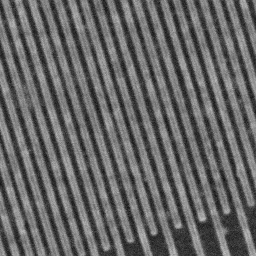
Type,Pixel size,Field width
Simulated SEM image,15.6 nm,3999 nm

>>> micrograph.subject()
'parallel lines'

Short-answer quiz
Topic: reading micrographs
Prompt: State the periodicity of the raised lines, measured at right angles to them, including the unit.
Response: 12.6 pixels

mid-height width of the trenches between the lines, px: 8.02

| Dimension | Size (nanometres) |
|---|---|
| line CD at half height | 69.2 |